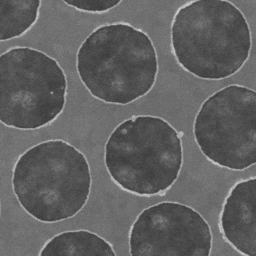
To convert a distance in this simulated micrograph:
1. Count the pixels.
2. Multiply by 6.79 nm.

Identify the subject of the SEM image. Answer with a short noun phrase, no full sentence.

holes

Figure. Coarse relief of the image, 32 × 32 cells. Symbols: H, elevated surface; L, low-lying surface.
LLLLLHHHHLLLLLLHHHHHHHHHLLLLLHHH
LLLLLHHHHHHHHHHHHHHHHHLLLLLLLLHH
LLLLHHHHHHHHHHHHHHHHHHLLLLLLLLLH
LLLLHHHHHHHHLLLLLHHHHHLLLLLLLLLH
LLHHHHHHHHHLLLLLLLHHHLLLLLLLLLLH
HHHHHHHHHHLLLLLLLLLHHHLLLLLLLLLH
HLLLLHHHHHLLLLLLLLLHHHLLLLLLLLLH
LLLLLLLHHHLLLLLLLLLLHHLLLLLLLLLH
LLLLLLLHHHLLLLLLLLLLHHHLLLLLLLHH
LLLLLLLLHHLLLLLLLLLHHHHHHLLLLHHH
LLLLLLLLHHHLLLLLLLLHHHHHHHHHHHHH
LLLLLLLLHHHLLLLLLLHHHHHHHHHLLLLL
LLLLLLLLHHHHHLLLLHHHHHHHHHLLLLLL
LLLLLLLLHHHHHHHHHHHHHHHHHLLLLLLL
LLLLLLLHHHHHHHHHHHHHHHHHHLLLLLLL
HLLLLLHHHHHHHHHLLLLLLHHHLLLLLLLL
HHHHHHHHHHHHHHLLLLLLLLHHLLLLLLLL
HHHHHHHHHHHHHHLLLLLLLLHHHLLLLLLL
HHHHLLLLLHHHHLLLLLLLLLLHHLLLLLLL
HHHLLLLLLLHHHLLLLLLLLLLHHHLLLLLL
HHLLLLLLLLLHHLLLLLLLLLLHHHHLLLLL
HHLLLLLLLLLHHHLLLLLLLLHHHHHHHHHH
HHLLLLLLLLLHHHLLLLLLLLHHHHHHHHHL
HHLLLLLLLLLHHHHHLLLLLHHHHHHHHLLL
HHLLLLLLLLLHHHHHHHHHHHHHHHHHHLLL
HHHLLLLLLLLHHHHHHHHHLLHHHHHHLLLL
HHHHLLLLLLHHHHHHHHLLLLLLHHHHLLLL
HHHHHLLHHHHHHHHHHLLHLLLLLLHHLLLL
HHHHHHHHHHHHHHHHHLLLLLLLLLHHLLLL
HHHHHHHLLLLLHHHHLLLLLLLLLLHHLLLL
HHHHHHLLLLLLLLHHLLLLLLLLLLHHHLLL
HHHHHLLLLLLLLLHHLLLLLLLLLLHHHHLL